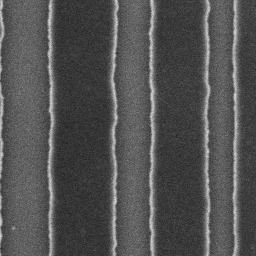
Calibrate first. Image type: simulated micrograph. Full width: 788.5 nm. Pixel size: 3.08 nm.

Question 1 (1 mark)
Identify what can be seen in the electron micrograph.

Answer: lines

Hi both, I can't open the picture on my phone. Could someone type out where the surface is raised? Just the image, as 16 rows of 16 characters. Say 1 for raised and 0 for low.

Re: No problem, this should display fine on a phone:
0001111001111001
0001111001111001
0001111001111001
0001111001111001
0001111001111001
0001111001111001
0001111001111001
0001111001111001
0001111000111001
0001111001111001
0001111001111001
0001111001111001
0001111001111001
0001111001111001
0001111001111001
0001111001111001